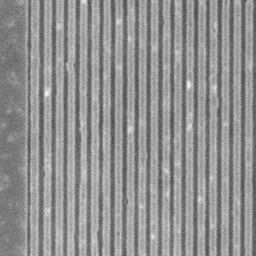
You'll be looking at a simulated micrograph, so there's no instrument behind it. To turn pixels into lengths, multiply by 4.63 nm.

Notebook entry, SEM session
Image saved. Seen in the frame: parallel lines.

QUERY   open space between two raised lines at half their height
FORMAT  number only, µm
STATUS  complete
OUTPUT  0.0243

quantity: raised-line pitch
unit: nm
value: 55.1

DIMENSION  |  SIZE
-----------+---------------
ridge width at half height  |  31.3 nanometres